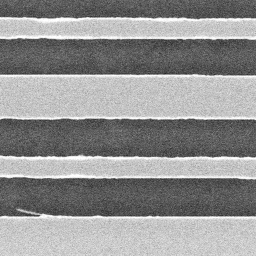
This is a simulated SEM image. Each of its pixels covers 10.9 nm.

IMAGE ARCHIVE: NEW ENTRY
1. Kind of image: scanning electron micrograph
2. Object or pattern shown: lines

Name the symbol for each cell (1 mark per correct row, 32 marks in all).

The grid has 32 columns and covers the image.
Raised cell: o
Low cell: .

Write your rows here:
................................
................................
ooooo..ooooooooooooooooo.oo.o.oo
oooooooooooooooooooooooooooooooo
oooooooooooooooooooooooooooooooo
................................
................................
................................
................................
ooooooooooooooooooooooooo.......
oooooooooooooooooooooooooooooooo
oooooooooooooooooooooooooooooooo
oooooooooooooooooooooooooooooooo
oooooooooooooooooooooooooooooooo
oooooooooooooooooooooooooooooooo
................................
................................
................................
................................
................................
oooooooooooooooooooooooooooooooo
oooooooooooooooooooooooooooooooo
................................
................................
................................
................................
................................
oooooooooooooooooooooooooooooooo
oooooooooooooooooooooooooooooooo
oooooooooooooooooooooooooooooooo
oooooooooooooooooooooooooooooooo
oooooooooooooooooooooooooooooooo